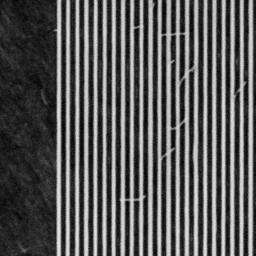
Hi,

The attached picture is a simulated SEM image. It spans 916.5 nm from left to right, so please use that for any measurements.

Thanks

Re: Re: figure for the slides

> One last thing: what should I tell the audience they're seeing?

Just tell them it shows parallel lines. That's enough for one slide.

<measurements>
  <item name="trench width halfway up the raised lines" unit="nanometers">18.8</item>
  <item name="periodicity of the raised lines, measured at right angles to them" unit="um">0.0327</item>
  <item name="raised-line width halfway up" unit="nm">12.5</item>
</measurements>